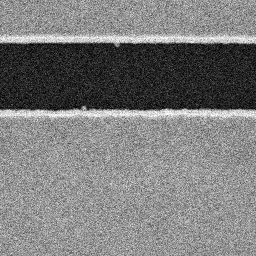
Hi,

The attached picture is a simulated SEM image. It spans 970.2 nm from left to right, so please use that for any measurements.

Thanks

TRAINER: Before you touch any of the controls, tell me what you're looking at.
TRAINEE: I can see one or a few lines or trenches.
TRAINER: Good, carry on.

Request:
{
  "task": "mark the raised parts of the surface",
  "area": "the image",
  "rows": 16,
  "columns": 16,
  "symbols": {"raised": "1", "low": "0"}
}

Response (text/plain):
1111111111111111
1111111111111111
0000000010000001
0000000000000000
0000000000000000
0000000000000000
0000000000000000
1111111111111111
1111111111111111
1111111111111111
1111111111111111
1111111111111111
1111111111111111
1111111111111111
1111111111111111
1111111111111111